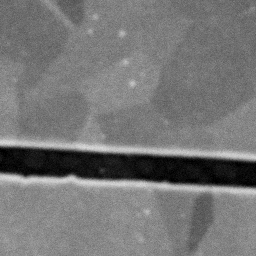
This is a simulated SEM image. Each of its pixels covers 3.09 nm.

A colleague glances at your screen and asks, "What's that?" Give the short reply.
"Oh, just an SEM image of one or a few lines or trenches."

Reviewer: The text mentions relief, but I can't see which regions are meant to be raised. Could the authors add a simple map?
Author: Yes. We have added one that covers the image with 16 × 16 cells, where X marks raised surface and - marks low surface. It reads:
XXXXXXXXXXXXXXXX
XXXXXXXXXXXXXXXX
XXXXXXXXXXXXXXXX
XXXXXXXXXXXXXXXX
XXXXXXXXXXXXXXXX
XXXXXXXXXXXXXXXX
XXXXXXXXXXXXXXXX
XXXXXXXXXXXXXXXX
XXXXXXXXXXXXXXXX
----------XXXXXX
----------------
XXXXXXXXX-------
XXXXXXXXXXXXXXXX
XXXXXXXXXXXXXXXX
XXXXXXXXXXXXXXXX
XXXXXXXXXXXXXXXX